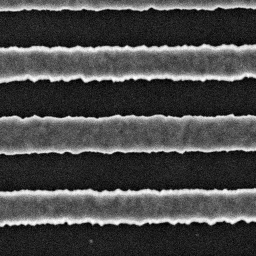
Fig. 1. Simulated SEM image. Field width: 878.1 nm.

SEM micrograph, lines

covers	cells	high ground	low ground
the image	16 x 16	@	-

@@@@@@@@@@@@@@@@
----------------
----------------
@@@@@@@@@@@@@@@@
@@@@@@@@@@@@@@@@
----------------
----------------
@@@@@@@@@@@@@@@@
@@@@@@@@@@@@@@@@
@@@@@-@---------
----------------
----------------
@@@@@@@@@@@@@@@@
@@@@@@@@@@@@@@@@
----------------
----------------